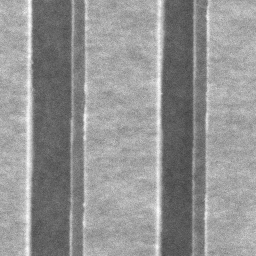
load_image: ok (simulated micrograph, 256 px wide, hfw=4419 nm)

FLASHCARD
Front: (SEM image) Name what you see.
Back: lines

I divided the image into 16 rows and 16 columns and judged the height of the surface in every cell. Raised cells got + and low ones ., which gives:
++...+++++..++++
++...+++++..++++
++...+++++..++++
++...+++++..++++
++...+++++..++++
++...+++++..++++
++...+++++..++++
++...+++++..++++
++...+++++..++++
++..++++++..++++
++..++++++..++++
++..++++++..++++
++..++++++..++++
++..++++++..++++
++..++++++..++++
++..++++++..++++